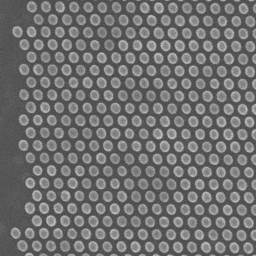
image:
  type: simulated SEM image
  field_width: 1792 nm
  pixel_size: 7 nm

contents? a regular array of raised bodies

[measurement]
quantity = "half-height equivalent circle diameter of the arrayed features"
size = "68.4 nanometers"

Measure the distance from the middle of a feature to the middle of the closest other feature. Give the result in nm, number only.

96.5